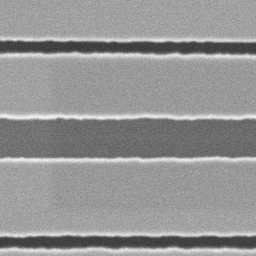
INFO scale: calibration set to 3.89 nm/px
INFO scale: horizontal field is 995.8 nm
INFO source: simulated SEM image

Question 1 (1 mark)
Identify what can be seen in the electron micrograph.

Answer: lines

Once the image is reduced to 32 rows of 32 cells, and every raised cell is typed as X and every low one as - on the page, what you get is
XXXXXXXXXXXXXXXXXXXXXXXXXXXXXXXX
XXXXXXXXXXXXXXXXXXXXXXXXXXXXXXXX
XXXXXXXXXXXXXXXXXXXXXXXXXXXXXXXX
XXXXXXXXXXXXXXXXXXXXXXXXXXXXXXXX
XXXXXXXXXXXXXXXXXXXXXXXXXXXXXXXX
--------------------------------
--------------------------------
XXXXXXXXXXXXXXXXXXXXXXXXXXXXXXXX
XXXXXXXXXXXXXXXXXXXXXXXXXXXXXXXX
XXXXXXXXXXXXXXXXXXXXXXXXXXXXXXXX
XXXXXXXXXXXXXXXXXXXXXXXXXXXXXXXX
XXXXXXXXXXXXXXXXXXXXXXXXXXXXXXXX
XXXXXXXXXXXXXXXXXXXXXXXXXXXXXXXX
XXXXXXXXXXXXXXXXXXXXXXXXXXXXXXXX
XXXXXXXXXXXXXXXXXXXXXXXXXXXXXXXX
--------------------------------
--------------------------------
--------------------------------
--------------------------------
--------------------------------
XXXXXXXXXXXXXXXXXXXXXXXXXXXXXXXX
XXXXXXXXXXXXXXXXXXXXXXXXXXXXXXXX
XXXXXXXXXXXXXXXXXXXXXXXXXXXXXXXX
XXXXXXXXXXXXXXXXXXXXXXXXXXXXXXXX
XXXXXXXXXXXXXXXXXXXXXXXXXXXXXXXX
XXXXXXXXXXXXXXXXXXXXXXXXXXXXXXXX
XXXXXXXXXXXXXXXXXXXXXXXXXXXXXXXX
XXXXXXXXXXXXXXXXXXXXXXXXXXXXXXXX
XXXXXXXXXXXXXXXXXXXXXXXXXXXXXXXX
-XX-----------------------------
--------------------------------
XXXXXXXXXXXXXXXXXXXXXXXXXXXXXXXX